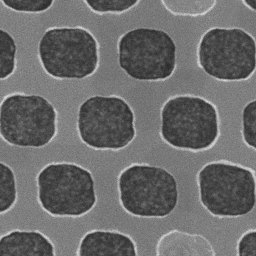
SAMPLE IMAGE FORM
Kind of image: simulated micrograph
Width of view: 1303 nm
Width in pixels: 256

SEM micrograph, holes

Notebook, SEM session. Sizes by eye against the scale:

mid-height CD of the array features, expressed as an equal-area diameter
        0.285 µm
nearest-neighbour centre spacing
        396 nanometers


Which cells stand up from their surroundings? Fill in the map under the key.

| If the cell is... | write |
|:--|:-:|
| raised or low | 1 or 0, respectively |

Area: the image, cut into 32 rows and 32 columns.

10000011111000000111111111111110
11111111111111111111111111111111
11111111111111111111111111111111
11111111111111111111111111111111
01111000000111100000011111000001
00111000000011100000001110000000
00111000000011100000001110000000
00111000000011100000001110000000
00111100000011100000001110000000
01111110000111110000011111100001
11111111111111111111111111111111
11111111111111111111111111111111
10000011111000011111100001111111
00000001110000001111000000011110
00000001110000000111000000011100
00000001110000000111000000011100
00000001110000000111000000011100
10000011110000001111100000011110
11111111111100011111111000111111
11111111111111111111111111111111
01111111011111111111111111101111
00111000000111100000011110000001
00111000000011100000001110000000
00111000000011100000001110000000
00111000000011100000001110000000
00111000000011100000001110000000
11111100000111110000011111000001
11111111111111111111111111111111
11111111111111111111111111111111
10000111111000001111111111111110
00000011110000000111111111111100
00000001110000000111111111111100